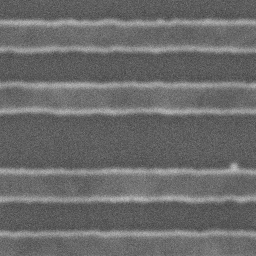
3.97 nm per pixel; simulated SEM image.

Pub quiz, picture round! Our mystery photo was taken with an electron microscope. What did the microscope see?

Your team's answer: lines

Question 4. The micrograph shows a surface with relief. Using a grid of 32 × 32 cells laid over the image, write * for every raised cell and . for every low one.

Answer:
................................
................................
................................
********************************
********************************
********************************
................................
................................
................................
................................
************.***********.******.
********************************
********************************
********************************
................................
................................
................................
................................
................................
................................
................................
********************************
********************************
********************************
********************************
................................
................................
................................
................................
********************************
********************************
********************************